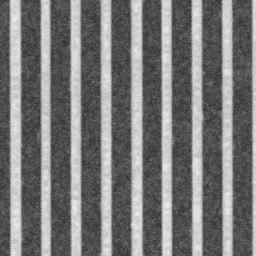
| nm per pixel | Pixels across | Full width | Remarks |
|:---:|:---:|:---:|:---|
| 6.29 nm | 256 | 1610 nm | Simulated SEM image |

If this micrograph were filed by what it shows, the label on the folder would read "parallel lines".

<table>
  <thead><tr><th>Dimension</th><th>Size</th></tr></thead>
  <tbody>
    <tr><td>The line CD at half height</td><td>51.1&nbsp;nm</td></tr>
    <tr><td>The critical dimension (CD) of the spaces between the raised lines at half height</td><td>0.135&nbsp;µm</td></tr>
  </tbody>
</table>